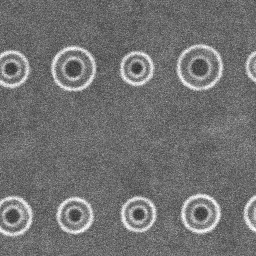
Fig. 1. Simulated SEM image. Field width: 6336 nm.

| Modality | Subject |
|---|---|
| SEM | ring-shaped raised bodies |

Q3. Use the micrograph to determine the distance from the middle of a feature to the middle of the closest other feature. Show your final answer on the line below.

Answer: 1560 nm